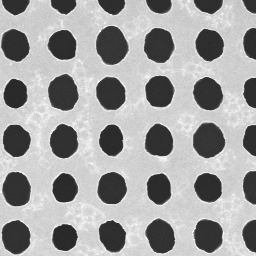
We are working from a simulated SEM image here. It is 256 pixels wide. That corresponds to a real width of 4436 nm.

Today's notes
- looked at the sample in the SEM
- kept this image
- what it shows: a regular array of holes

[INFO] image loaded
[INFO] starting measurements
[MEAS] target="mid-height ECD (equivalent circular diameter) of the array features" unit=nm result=527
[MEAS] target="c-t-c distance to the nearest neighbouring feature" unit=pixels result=47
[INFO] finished